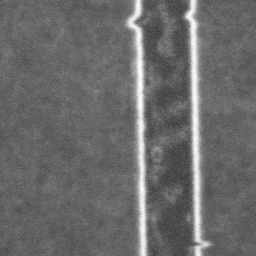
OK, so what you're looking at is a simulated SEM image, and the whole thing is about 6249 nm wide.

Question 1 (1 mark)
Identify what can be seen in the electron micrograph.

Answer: one or a few lines or trenches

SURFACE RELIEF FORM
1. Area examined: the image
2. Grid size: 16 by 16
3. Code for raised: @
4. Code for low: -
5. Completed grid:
@@@@@@@@@---@@@@
@@@@@@@@----@@@@
@@@@@@@@@---@@@@
@@@@@@@@@---@@@@
@@@@@@@@@---@@@@
@@@@@@@@@---@@@@
@@@@@@@@@---@@@@
@@@@@@@@@---@@@@
@@@@@@@@@---@@@@
@@@@@@@@@---@@@@
@@@@@@@@@---@@@@
@@@@@@@@@---@@@@
@@@@@@@@@---@@@@
@@@@@@@@@---@@@@
@@@@@@@@@---@@@@
@@@@@@@@@---@@@@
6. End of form